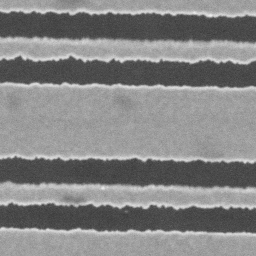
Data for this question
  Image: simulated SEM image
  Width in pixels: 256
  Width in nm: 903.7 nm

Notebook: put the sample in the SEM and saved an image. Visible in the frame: lines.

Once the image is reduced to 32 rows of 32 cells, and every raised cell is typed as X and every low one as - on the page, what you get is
XXXXXXXXXXXXXXXXXXXXXXXXXXXXXXXX
X--X-X-XXXXXXXXXXXXXXXXXXXXXXXXX
--------------------------------
--------------------------------
--------------------------------
XXXXXXXXXXXXXXXXXX-XXXXX--XXX---
XXXXXXXXXXXXXXXXXXXXXXXXXXXXXXXX
----XXX---XXXX-XXXXXXXXXXXXXXXXX
--------------------------------
--------------------------------
XX--X---X-----------------------
XXXXXXXXXXXXXXXXXXXXXXXXXXXXXXXX
XXXXXXXXXXXXXXXXXXXXXXXXXXXXXXXX
XXXXXXXXXXXXXXXXXXXXXXXXXXXXXXXX
XXXXXXXXXXXXXXXXXXXXXXXXXXXXXXXX
XXXXXXXXXXXXXXXXXXXXXXXXXXXXXXXX
XXXXXXXXXXXXXXXXXXXXXXXXXXXXXXXX
XXXXXXXXXXXXXXXXXXXXXXXXXXXXXXXX
XXXXXXXXXXXXXXXXXXXXXXXXXXXXXXXX
XXXXXXXXXXXXXXXXXXXXXXXXXXXXXXXX
--------------------------------
--------------------------------
--------------------------------
XXXXXXXXXXXXXXXXX-XXXXX---------
XXXXXXXXXXXXXXXXXXXXXXXXXXXXXXXX
X-XXXX-XXXXXXXXXXXXXXXXXXXXXXXXX
--------------------------------
--------------------------------
XX------------------------------
XXXXXXXXXXXXXXXXXXXXXXXXXXXXXXXX
XXXXXXXXXXXXXXXXXXXXXXXXXXXXXXXX
XXXXXXXXXXXXXXXXXXXXXXXXXXXXXXXX